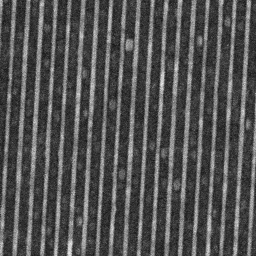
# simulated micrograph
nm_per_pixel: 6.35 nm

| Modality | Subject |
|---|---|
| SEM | parallel lines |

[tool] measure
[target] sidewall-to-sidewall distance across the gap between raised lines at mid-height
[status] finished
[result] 65.7 nm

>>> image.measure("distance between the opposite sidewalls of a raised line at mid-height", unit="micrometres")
0.0206